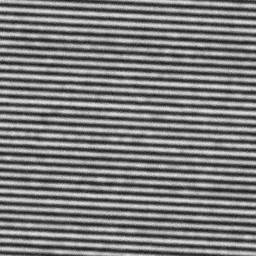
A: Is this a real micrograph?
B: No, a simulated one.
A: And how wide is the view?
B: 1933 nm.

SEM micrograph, parallel lines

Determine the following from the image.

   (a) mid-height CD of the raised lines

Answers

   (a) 28.3 nanometres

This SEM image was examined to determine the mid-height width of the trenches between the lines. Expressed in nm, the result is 35.8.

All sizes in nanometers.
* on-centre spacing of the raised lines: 62.3